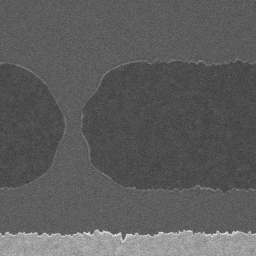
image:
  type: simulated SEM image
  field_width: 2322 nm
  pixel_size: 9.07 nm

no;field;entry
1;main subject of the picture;one or a few lines or trenches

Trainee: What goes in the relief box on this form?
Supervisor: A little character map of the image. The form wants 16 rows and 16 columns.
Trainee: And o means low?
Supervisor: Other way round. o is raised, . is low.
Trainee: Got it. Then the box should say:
................
................
................
................
oo.....ooooooooo
ooo...oooooooooo
oooo.ooooooooooo
oooo.ooooooooooo
oooo.ooooooooooo
oooo..oooooooooo
ooo...oooooooooo
oo.....ooooooooo
................
................
......o....o....
oooooooooooooooo